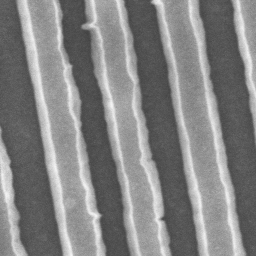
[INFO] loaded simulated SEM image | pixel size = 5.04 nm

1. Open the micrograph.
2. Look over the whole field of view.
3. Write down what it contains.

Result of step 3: one or a few lines or trenches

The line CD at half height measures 32.9 pixels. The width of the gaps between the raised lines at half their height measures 188 nm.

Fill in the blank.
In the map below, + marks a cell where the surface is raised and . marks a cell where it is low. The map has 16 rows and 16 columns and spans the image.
.+++..++..++...+
..++..++..++...+
..++..++..+++..+
..++..++...++..+
..++..++...++...
..++...+...++...
...++..++..++...
...++..++..++...
...++..++..+++..
...++..++...++..
...++...+...++..
+..+++..++..++..
+...++..++..++..
+...++..++..++..
+...++..++...++.
+...++..++...++.